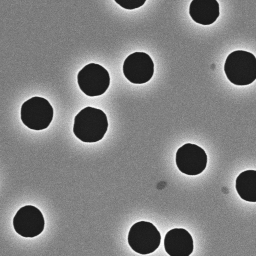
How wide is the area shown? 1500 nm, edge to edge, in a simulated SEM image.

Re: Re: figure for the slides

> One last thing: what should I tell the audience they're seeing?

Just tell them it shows holes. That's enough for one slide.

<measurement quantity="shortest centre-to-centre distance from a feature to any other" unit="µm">0.321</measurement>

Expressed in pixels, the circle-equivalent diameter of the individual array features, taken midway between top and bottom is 32.4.